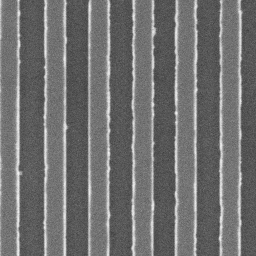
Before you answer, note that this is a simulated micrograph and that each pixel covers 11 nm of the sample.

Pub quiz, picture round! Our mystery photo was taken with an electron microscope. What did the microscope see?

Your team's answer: lines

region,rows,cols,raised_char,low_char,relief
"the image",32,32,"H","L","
HHLLLLHHLLLHHHLLLHHLLLHHLLLLHHLL
HHLLLLHHLLLHHHLLLHHLLLHHLLLLHHLL
HHLLLLHHLLLHHHLLLHHLLLHHLLLLHHLL
HHLLLLHHLLLHHHLLLHHLLLHHHLLLHHLL
HHLLLLHHLLLHHHLLLHHLLLHHHLLLHHLL
HHLLLLHHLLLHHHLLLHHLLLHHHLLLHHLL
HHLLLLHHLLLHHHLLLHHLLLHHHLLLHHLL
HHLLLLHHLLLHHHLLLHHLLLHHHLLLHHLL
HHLLLLHHLLLHHHLLLHHLLLHHLLLLHHLL
HHLLLLHHLLLHHHLLLHHLLLHHLLLLHHLL
HHLLLLHHLLLHHHLLLHHLLLHHHLLLHHLL
HHLLLLHHLLLHHHLLLHHLLLHHHLLLHHLL
HHLLLLHHLLLHHHLLLHHLLLHHLLLLHHLL
HHLLLLHHLLLHHHLLLHHLLLHHLLLLHHLL
HHLLLLHHLLLHHHLLLHHLLLHHLLLLHHLL
HHLLLLHHLLLHHHLLLHHLLLHHLLLLHHLL
HHLLLLHHLLLHHHLLLHHLLLHHLLLLHHLL
HHLLLLHHLLLHHHLLLHHLLLHHLLLLHHLL
HHLLLLHHLLLHHHLLLHHLLLHHLLLLHHLL
HHLLLLHHLLLHHHLLLHHLLLHHLLLLHHLL
HHLLLLHHLLLHHHLLLHHLLLHHLLLLHHLL
HHLLLLHHLLLHHHLLLHHLLLHHLLLLHHLL
HHLLLLHHLLLHHHLLLHHLLLHHLLLLHHLL
HHLLLLHHLLLHHHLLLHHLLLHHLLLLHHLL
HHLLLLHHLLLHHHLLLHHLLLHHLLLLHHLL
HHLLLLHHLLLHHHLLLHHLLLHHLLLLHHLL
HHLLLLHHLLLHHHLLLHHLLLHHLLLLHHLL
HHLLLLHHLLLHHHLLLHHLLLHHLLLLHHLL
HHLLLLHHLLLHHHLLLHHLLLHHLLLLHHLL
HHLLLLHHLLLHHHLLLHHLLLHHLLLHHHLL
HHLLLLHHLLLHHHLLLHHLLLHHLLLLHHLL
HHLLLLHHLLLHHHLLLHHLLLHHLLLLHHLL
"